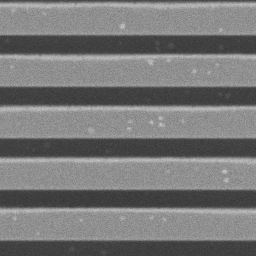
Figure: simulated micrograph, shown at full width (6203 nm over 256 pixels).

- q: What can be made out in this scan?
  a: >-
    lines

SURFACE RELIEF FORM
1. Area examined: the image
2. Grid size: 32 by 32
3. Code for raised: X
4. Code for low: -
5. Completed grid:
XXXXXXXXXXXXXXXXXXXXXXXXXXXXXXXX
XXXXXXXXXXXXXXXXXXXXXXXXXXXXXXXX
XXXXXXXXXXXXXXXXXXXXXXXXXXXXXXXX
XXXXXXXXXXXXXXXXXXXXXXXXXXXXXXXX
--------------------------------
--------------------------------
--------------------------------
XXXXXXXXXXXXXXXXXXXXXXXXXXXXXXXX
XXXXXXXXXXXXXXXXXXXXXXXXXXXXXXXX
XXXXXXXXXXXXXXXXXXXXXXXXXXXXXXXX
XXXXXXXXXXXXXXXXXXXXXXXXXXXXXXXX
--------------------------------
--------------------------------
XXXXXXXXXXXXXXXXXXXXXXXXXXXXXXXX
XXXXXXXXXXXXXXXXXXXXXXXXXXXXXXXX
XXXXXXXXXXXXXXXXXXXXXXXXXXXXXXXX
XXXXXXXXXXXXXXXXXXXXXXXXXXXXXXXX
--------------------------------
--------------------------------
--------------------------------
XXXXXXXXXXXXXXXXXXXXXXXXXXXXXXXX
XXXXXXXXXXXXXXXXXXXXXXXXXXXXXXXX
XXXXXXXXXXXXXXXXXXXXXXXXXXXXXXXX
XXXXXXXXXXXXXXXXXXXXXXXXXXXXXXXX
--------------------------------
--------------------------------
XXXXXXXXXXXXXXXXXXXXXXXXXXXXXXXX
XXXXXXXXXXXXXXXXXXXXXXXXXXXXXXXX
XXXXXXXXXXXXXXXXXXXXXXXXXXXXXXXX
XXXXXXXXXXXXXXXXXXXXXXXXXXXXXXXX
--------------------------------
--------------------------------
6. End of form